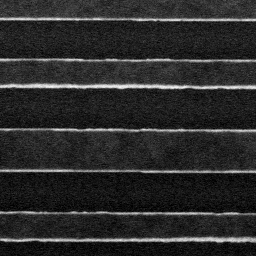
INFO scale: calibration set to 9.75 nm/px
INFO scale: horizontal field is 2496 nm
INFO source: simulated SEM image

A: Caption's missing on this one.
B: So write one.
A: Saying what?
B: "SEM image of lines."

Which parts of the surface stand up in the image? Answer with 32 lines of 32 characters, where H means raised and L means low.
HHHHHHHHHHHHHHHHHHHHHHHHHHHHHHHH
HHHHHHHHHHHHHHHHHHHHHHHHHHHHHHHH
LLLLLLLLLLLLLLLLLHHLLHHLHHHHHHHH
LLLLLLLLLLLLLLLLLLLLLLLLLLLLLLLL
LLLLLLLLLLLLLLLLLLLLLLLLLLLLLLLL
LLLLLLLLLLLLLLLLLLLLLLLLLLLLLLLL
LLLLLLLLLLLLLLLLLLLLLLLLLLLLLLLL
HHHHHHHHHHHLLHLLLLHHHHLLLLLLLLLL
HHHHHHHHHHHHHHHHHHHHHHHHHHHHHHHH
HHHHHHHHHHHHHHHHHHHHHHHHHHHHHHHH
HHHHHHHHHHHHHHHHHHHHHHHHHHHHHHHH
LLLLLLLLLLLLLLLLLLLLLLLLLLLLLLLL
LLLLLLLLLLLLLLLLLLLLLLLLLLLLLLLL
LLLLLLLLLLLLLLLLLLLLLLLLLLLLLLLL
LLLLLLLLLLLLLLLLLLLLLLLLLLLLLLLL
LLLLLLLLLLLLLLLLLLLLLLLLLLLLLLLL
HHHHHHHHHHHHHHHHHHHHHHHHHHHHHHHH
HHHHHHHHHHHHHHHHHHHHHHHHHHHHHHHH
HHHHHHHHHHHHHHHHHHHHHHHHHHHHHHHH
HHHHHHHHHHHHHHHHHHHHHHHHHHHHHHHH
HHHHHHHHHHHHHHHHHHHHHHHHHHHHHHHH
LLLLLLLLLLLLLLLLLLHHHHHHHHHHHHHH
LLLLLLLLLLLLLLLLLLLLLLLLLLLLLLLL
LLLLLLLLLLLLLLLLLLLLLLLLLLLLLLLL
LLLLLLLLLLLLLLLLLLLLLLLLLLLLLLLL
LLLLLLLLLLLLLLLLLLLLLLLLLLLLLLLL
LLLLLLLLLLLLLLLLLLLLLLLLLLLLLLLL
HHHHHHHHHHHHHHHHHHHHHHHHHHHHHHHH
HHHHHHHHHHHHHHHHHHHHHHHHHHHHHHHH
HHHHHHHHHHHHHHHHHHHHHHHHHHHHHHHH
LLLLLLLLLLLLLLLLLLLLLLLLLLLLLLLL
LLLLLLLLLLLLLLLLLLLLLLLLLLLLLLLL